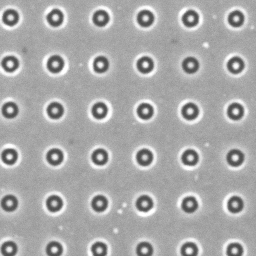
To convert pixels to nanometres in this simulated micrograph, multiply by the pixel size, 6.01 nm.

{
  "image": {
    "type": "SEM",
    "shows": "a regular array of ring-shaped grooves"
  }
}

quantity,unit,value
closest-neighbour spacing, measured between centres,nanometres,270